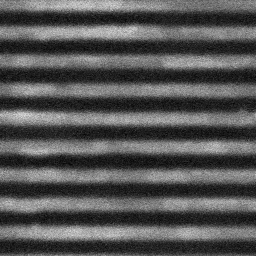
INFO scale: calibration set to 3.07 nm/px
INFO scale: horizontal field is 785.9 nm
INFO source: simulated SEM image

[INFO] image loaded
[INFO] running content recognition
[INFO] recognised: parallel lines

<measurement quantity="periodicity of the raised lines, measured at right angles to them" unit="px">28.6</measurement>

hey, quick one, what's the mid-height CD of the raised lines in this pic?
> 32.7 nm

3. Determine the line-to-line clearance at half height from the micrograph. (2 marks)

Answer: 0.0565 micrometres